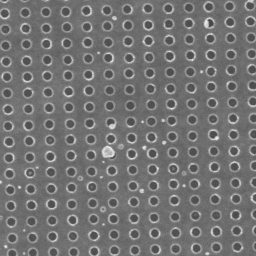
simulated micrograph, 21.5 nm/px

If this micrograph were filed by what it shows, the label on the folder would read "a regular array of holes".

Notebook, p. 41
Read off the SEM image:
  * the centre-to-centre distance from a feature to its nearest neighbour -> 15.8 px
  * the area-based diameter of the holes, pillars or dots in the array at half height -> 8.44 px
